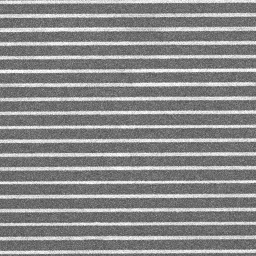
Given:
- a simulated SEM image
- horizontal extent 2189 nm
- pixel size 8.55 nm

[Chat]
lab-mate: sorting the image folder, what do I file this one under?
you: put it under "parallel lines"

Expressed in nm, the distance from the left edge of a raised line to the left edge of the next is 119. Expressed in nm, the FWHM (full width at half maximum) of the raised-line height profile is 24.6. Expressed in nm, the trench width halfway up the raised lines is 93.